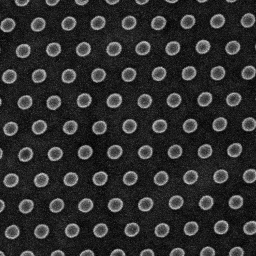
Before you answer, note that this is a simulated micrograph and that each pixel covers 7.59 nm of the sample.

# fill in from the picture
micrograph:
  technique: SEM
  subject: a regular array of raised bodies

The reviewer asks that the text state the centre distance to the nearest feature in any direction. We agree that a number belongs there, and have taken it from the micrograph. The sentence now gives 221 nanometers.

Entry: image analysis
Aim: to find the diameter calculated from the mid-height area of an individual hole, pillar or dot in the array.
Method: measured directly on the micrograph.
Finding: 0.0999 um